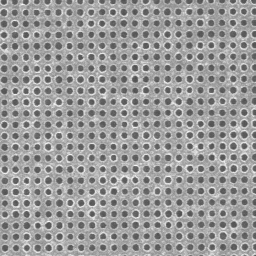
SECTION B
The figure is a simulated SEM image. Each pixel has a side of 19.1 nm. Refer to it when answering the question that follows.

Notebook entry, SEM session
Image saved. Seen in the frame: a regular array of holes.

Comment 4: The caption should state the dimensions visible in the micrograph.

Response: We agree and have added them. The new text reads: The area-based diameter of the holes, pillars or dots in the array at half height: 129 nm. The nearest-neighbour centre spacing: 205 nm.